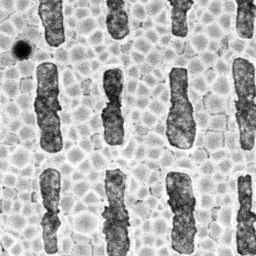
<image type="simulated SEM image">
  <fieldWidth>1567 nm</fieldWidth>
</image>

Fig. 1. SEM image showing holes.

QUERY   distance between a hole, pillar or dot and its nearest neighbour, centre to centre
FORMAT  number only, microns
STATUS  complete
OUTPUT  0.306